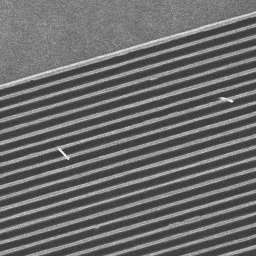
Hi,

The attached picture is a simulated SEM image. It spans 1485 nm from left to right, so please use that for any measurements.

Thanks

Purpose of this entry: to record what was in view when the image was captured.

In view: parallel lines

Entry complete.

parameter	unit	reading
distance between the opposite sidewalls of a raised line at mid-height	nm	21.6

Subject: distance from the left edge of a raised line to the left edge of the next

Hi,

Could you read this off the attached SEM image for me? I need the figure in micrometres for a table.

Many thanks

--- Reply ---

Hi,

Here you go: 0.0617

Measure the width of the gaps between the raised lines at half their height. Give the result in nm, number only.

37.6